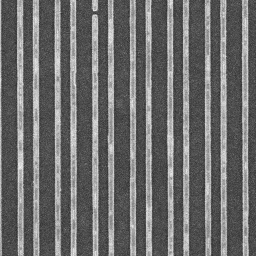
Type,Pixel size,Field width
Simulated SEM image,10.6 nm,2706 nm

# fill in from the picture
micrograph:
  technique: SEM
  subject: parallel lines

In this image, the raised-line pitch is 198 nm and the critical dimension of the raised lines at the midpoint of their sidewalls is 48.9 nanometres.